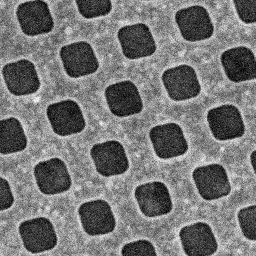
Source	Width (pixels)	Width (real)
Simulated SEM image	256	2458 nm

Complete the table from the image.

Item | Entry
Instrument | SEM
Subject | a regular array of holes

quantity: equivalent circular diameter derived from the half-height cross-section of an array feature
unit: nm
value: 359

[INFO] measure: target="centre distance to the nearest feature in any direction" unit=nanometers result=573